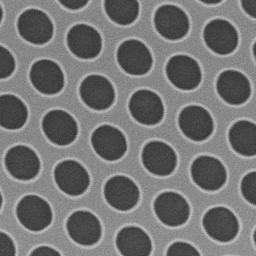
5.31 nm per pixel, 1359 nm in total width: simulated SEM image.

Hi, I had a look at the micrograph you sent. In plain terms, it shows a regular array of holes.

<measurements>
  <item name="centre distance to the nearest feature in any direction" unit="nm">272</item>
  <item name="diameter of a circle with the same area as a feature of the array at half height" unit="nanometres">190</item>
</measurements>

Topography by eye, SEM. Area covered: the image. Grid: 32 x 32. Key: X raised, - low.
XXXXXXXX---XX----XXXXXXXXX-XXX--
XXX--XXXXXXXX----XX----XXXXXXXX-
XX----XXXXXXXX---XX-----XXX-XXXX
XX-----XX---XXXXXXX-----XX---XXX
XXX----X-----XXXXXXX---XX-----XX
XXXX--XX-----XX---XXXXXXXX----XX
-XXXXXXXX----XX----XXXXXXXX--XXX
--XXX-XXXXXXXXX----XX---XXXXXXXX
--XX----XXXXXXX----XX----XXXXXXX
-XXX----XXX--XXXXXXXX----XX----X
XXXX----XX----XXXXXXXX---XX----X
XXXXX--XXX----XXX--XXXXXXXX----X
---XXXXXXX----XX----XXXXXXXX---X
---XXXXXXXX---XX----XXX--XXXXXXX
---XXX---XXXXXXX----XX----XXXXXX
---XX-----XXXXXXXX--XX-----XX---
XXXXX-----XX---XXXXXXXX----XX---
XXXXXX---XX-----XXXXXXXX--XXX---
X---XXXXXXXX----XX---XXXXXXXX---
X----XXXXXXX---XXX----XXX-XXXXX-
X----XX---XXXXXXXX----XX----XXXX
X----XX----XXXXXXXX---XX----XXX-
XX--XXX----XXX--XXXXXXXX----XX--
XXXXXXX----XX----XXXXXXXX---XX--
XXX--XXXXXXXX----XXX---XXXXXXX--
XX----XXXXXXXX---XX-----XXXXXXX-
XX----XXX--XXXXXXXX-----XX---XXX
XX----XX----XXXXXXXX---XX-----XX
XXX---XX-----XX---XXXXXXXX----XX
-XXXXXXXX----XX----XXXXXXX----XX
--XXXXXXXX--XX-----XX---XXXXXXXX
--XX---XXXXXXXX----XX----XXXXXXX